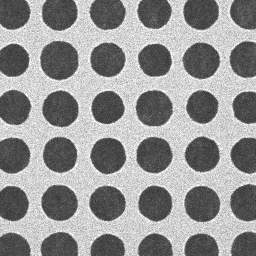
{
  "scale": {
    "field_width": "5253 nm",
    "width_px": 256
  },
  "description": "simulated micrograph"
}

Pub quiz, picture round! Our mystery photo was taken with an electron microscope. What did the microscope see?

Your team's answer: a regular array of holes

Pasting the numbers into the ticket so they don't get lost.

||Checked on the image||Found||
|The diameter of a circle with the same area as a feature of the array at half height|0.744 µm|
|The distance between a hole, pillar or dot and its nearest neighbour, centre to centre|954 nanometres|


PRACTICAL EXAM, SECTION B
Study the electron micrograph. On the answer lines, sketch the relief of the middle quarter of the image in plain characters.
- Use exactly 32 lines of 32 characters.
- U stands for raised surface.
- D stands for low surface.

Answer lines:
DDDDUUUDDDDDDDDUUUUDDDDDDDDUUUDD
DDDUUUUDDDDDDDDUUUUDDDDDDDUUUUDD
DDUUUUUUDDDDDDUUUUUUDDDDDDUUUUUD
DUUUUUUUUUUUUUUUUUUUUUUUUUUUUUUU
UUUUUUUUUUUUUUUUUUUUUUUUUUUUUUUU
UUUUUUUUUUUUUUUUUUUUUUUUUUUUUUUU
UUUUUUUUUUUUUUUUUUUUUDDDUUUUUUUU
DDUUUUUUUDDDDUUUUUUDDDDDDUUUUUUU
DDDUUUUUDDDDDDUUUUDDDDDDDDUUUUUD
DDDUUUUDDDDDDDDUUUDDDDDDDDDUUUUD
DDDDUUUDDDDDDDDUUUDDDDDDDDDUUUUD
DDDDUUUDDDDDDDDUUUDDDDDDDDDUUUUD
DDDDUUUDDDDDDDDUUUDDDDDDDDDUUUUD
DDDUUUUDDDDDDDUUUUDDDDDDDDDUUUUU
DDDUUUUUDDDDDUUUUUUDDDDDDDUUUUUU
DUUUUUUUUUUUUUUUUUUUUDDDUUUUUUUU
UUUUUUUUUUUUUUUUUUUUUUUUUUUUUUUU
UUUUUUUUUUUUUUUUUUUUUUUUUUUUUUUU
UUUUUUUUUDDDDUUUUUUUUDDDDUUUUUUU
DDUUUUUUDDDDDDUUUUUDDDDDDDUUUUUU
DDDUUUUDDDDDDDDUUUUDDDDDDDDUUUUD
DDDUUUUDDDDDDDDUUUDDDDDDDDDUUUDD
DDDUUUUDDDDDDDDUUUDDDDDDDDDUUUDD
DDDUUUUDDDDDDDDDUUDDDDDDDDDUUUDD
DDDUUUUDDDDDDDDUUUDDDDDDDDDUUUUD
DDDUUUUDDDDDDDDUUUUDDDDDDDUUUUUD
DDUUUUUUDDDDDDUUUUUUDDDDDUUUUUUU
UUUUUUUUUUDDUUUUUUUUUUDUUUUUUUUU
UUUUUUUUUUUUUUUUUUUUUUUUUUUUUUUU
UUUUUUUUUUUUUUUUUUUUUUUUUUUUUUUU
DUUUUUUUUDDDUUUUUUUUUDDDUUUUUUUU
DDUUUUUUDDDDDDUUUUUUDDDDDDUUUUUD